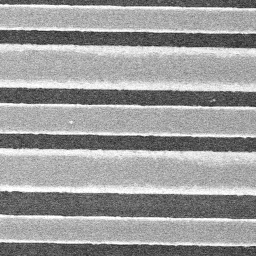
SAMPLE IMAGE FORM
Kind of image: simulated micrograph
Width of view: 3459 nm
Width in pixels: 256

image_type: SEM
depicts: lines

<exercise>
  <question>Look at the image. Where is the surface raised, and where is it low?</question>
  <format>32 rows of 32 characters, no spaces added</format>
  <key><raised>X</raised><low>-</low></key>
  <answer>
--------------------------------
XXXXXXXXXXXXXXXXXXXXXXXXXXXXXXXX
XXXXXXXXXXXXXXXXXXXXXXXXXXXXXXXX
XXXXXXXXXXXXXXXXXXXXXXXXXXXXXXXX
--------------------------------
--------------------------------
XXXXXXXXXXXXXXXXXXXXXXXXXXXXXXXX
XXXXXXXXXXXXXXXXXXXXXXXXXXXXXXXX
XXXXXXXXXXXXXXXXXXXXXXXXXXXXXXXX
XXXXXXXXXXXXXXXXXXXXXXXXXXXXXXXX
XXXXXXXXXXXXXXXXXXXXXXXXXXXXXXXX
--------------------------------
--------------------------------
XXXXXXXXXXXXXXXXXXXXXXXXXXXXXXXX
XXXXXXXXXXXXXXXXXXXXXXXXXXXXXXXX
XXXXXXXXXXXXXXXXXXXXXXXXXXXXXXXX
XXXXXXXXXXXXXXXXXXXXXXXXXXXXXXXX
--------------------------------
--------------------------------
XXXXXXXXXXXXXXXXXXXXXXXXXXXXXXXX
XXXXXXXXXXXXXXXXXXXXXXXXXXXXXXXX
XXXXXXXXXXXXXXXXXXXXXXXXXXXXXXXX
XXXXXXXXXXXXXXXXXXXXXXXXXXXXXXXX
XXXXXXXXXXXXXXXXXXXXXXXXXXXXXXXX
--------------------------------
--------------------------------
--------------------------------
XXXXXXXXXXXXXXXXXXXXXXXXXXXXXXXX
XXXXXXXXXXXXXXXXXXXXXXXXXXXXXXXX
XXXXXXXXXXXXXXXXXXXXXXXXXXXXXXXX
--------------------XXXXXXXXXXXX
--------------------------------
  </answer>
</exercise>